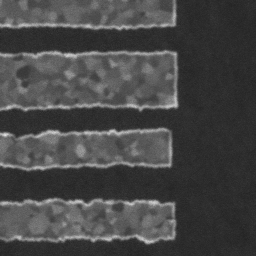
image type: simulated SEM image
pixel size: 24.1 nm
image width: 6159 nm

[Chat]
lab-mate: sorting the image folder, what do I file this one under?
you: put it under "one or a few lines or trenches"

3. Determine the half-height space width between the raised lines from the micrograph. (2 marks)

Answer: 680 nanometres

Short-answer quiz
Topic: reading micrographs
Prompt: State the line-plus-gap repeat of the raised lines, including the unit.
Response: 1.69 µm